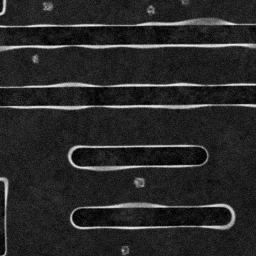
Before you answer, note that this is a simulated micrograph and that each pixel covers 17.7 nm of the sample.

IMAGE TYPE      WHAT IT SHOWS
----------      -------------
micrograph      groups of lines, slits or small figures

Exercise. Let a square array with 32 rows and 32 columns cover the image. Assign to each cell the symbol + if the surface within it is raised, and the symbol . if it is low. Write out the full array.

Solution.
.+++++++++++++++++++++++++++++++
++++++++++++++++++++++++++++++++
++++++++++++++++++++++++++++++++
................................
................................
................................
++++++++++++++++++++++++++++++++
++++++++++++++++++++++++++++++++
++++++++++++++++++++++++++++++++
++++++++++++++++++++++++++++++++
++++++++++++++++++++++++++++++++
................................
................................
++++++++..++++++++++++++++++++++
++++++++++++++++++++++++++++++++
++++++++++++++++++++++++++++++++
++++++++++++++++++++++++++++++++
++++++++++++++++++++++++++++++++
+++++++++................+++++++
+++++++++.................++++++
+++++++++................+++++++
++++++++++++++++++++++++++++++++
++++++++++++++++++++++++++++++++
.+++++++++++++++++++++++++++++++
.+++++++++++++++++++++++++++++++
.+++++++++++++++++++++++++++++++
.++++++++....................+++
.++++++++....................+++
.+++++++++.++++...++++++++++++++
.+++++++++++++++++++++++++++++++
.+++++++++++++++++++++++++++++++
.+++++++++++++++++++++++++++++++